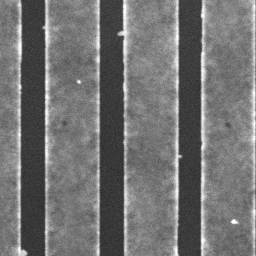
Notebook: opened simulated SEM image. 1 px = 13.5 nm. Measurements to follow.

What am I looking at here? lines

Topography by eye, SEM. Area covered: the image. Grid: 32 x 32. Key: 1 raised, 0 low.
11100011111100011111110001111111
11100011111100011111110001111111
11100011111100011111110001111111
11100011111100011111110001111111
11100011111100001111110001111111
11100011111100011111110001111111
11100011111100011111110001111111
11100011111100011111110001111111
11000011111100001111110001111111
11000011111100011111110001111111
11100011111100011111110001111111
11000011111100011111110001111111
11000011111100001111110001111111
11000011111100001111110001111111
11000011111100001111110001111111
11000011111100001111110001111111
11000011111100001111110001111111
11000011111100011111110001111111
11000011111100001111110001111111
11000011111100001111110001111111
11000011111100001111110001111111
11000011111100001111110001111111
11000011111100001111110001111111
11000011111100001111110001111111
11000011111100001111110001111111
11000011111100001111110001111111
11000011111100001111110001111111
11000011111100001111110001111111
11000011111100001111110001111111
11000011111100001111110001111111
11000011111100001111110001111111
11000011111100001111110001111111